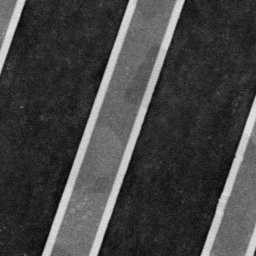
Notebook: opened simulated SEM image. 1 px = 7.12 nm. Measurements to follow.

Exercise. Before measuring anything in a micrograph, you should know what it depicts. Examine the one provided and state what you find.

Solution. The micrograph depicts one or a few lines or trenches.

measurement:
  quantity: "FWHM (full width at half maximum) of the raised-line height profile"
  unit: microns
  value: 0.32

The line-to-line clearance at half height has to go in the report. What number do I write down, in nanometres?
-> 751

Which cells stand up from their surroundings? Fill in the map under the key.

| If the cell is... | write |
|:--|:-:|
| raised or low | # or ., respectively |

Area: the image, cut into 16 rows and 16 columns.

#.......###.....
#.......###.....
.......###......
.......###......
.......###......
......###.......
......###.......
......###.......
.....###.......#
.....###.......#
.....###.......#
....###.......##
....###.......##
....###.......##
...###.......###
...###.......###